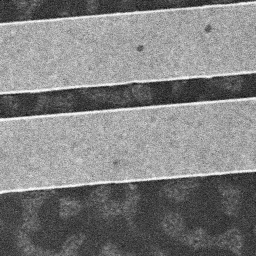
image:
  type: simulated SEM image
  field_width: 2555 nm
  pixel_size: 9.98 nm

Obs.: one or a few lines or trenches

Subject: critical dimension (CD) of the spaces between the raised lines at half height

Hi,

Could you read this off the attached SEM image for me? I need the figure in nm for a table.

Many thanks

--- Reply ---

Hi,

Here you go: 255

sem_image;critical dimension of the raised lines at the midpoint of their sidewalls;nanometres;706